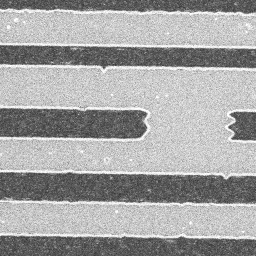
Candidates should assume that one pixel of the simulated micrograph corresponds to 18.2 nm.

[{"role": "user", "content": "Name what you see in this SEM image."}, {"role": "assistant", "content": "one or a few lines or trenches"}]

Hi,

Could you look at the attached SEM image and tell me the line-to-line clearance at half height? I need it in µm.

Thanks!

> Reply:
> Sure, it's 0.598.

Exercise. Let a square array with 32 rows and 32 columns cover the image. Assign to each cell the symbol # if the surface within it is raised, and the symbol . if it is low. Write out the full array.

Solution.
################################
..........###.##################
................................
................................
................................
................................
################################
################################
............##.......#.#########
................................
................................
................................
................................
#####...........................
##################...........###
##################...........###
##################...........###
...............#.............###
................................
................................
................................
######..##......................
################################
################################
################################
.................#....##########
................................
................................
................................
################......#.........
################################
################################